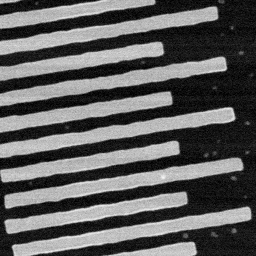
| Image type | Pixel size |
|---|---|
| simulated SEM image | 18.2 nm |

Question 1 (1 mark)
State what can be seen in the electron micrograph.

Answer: groups of lines, slits or small figures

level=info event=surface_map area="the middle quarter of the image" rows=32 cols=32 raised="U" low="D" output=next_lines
UUUUUUUUDDDDDDDDDDDDDDDDDDUUUUUU
DDDDDDDDDDDDDDDDDDDDUUUUUUUUUUUU
DDDDDDDDDDDDDDDUUUUUUUUUUUUUUUUU
DDDDDDDDDUUUUUUUUUUUUUUUUUUDDDDD
UUUUUUUUUUUUUUUUUUUUUDDDDDDDDDDD
UUUUUUUUUUUUUUDDDDDDDDDDDDDDDDDD
UUUUUUUUDDDDDDDDDDDDDDDDDDDDDDDD
UDDDDDDDDDDDDDDDDDDDDDDUUUUDDDDD
DDDDDDDDDDDDDDDDDUUUUUUUUUUDDDDD
DDDDDDDDDDDUUUUUUUUUUUUUUUUDDDDD
DDDDDUUUUUUUUUUUUUUUUUUUUDDDDDDD
UUUUUUUUUUUUUUUUUUDDDDDDDDDDDDDD
UUUUUUUUUUUUDDDDDDDDDDDDDDDDDDDD
UUUUUUDDDDDDDDDDDDDDDDDDDDDUUUUU
DDDDDDDDDDDDDDDDDDDUUUUUUUUUUUUU
DDDDDDDDDDDDUUUUUUUUUUUUUUUUUUUU
DDDDDDDUUUUUUUUUUUUUUUUUUUDDDDDD
DDDDUUUUUUUUUUUUUUUDDDDDDDDDDDDD
UUUUUUUUUUUUUDDDDDDDDDDDDDDDDDDD
UUUUUUUUDDDDDDDDDDDDDDDDDDUUDDDD
UDDDDDDDDDDDDDDDDDDDDDUUUUUUUDDD
DDDDDDDDDDDDDDDUUUUUUUUUUUUUUDDD
DDDDDDDDDUUUUUUUUUUUUUUUUUUUDDDD
DDDDDUUUUUUUUUUUUUUUUUUUDDDDDDDD
UUUUUUUUUUUUUUUUDDDDDDDDDDDDDDDD
UUUUUUUUUUUDDDDDDDDDDDDDDDDDDDUU
UUUUUDDDDDDDDDDDDDDDDDDDDUUUUUUU
DDDDDDDDDDDDDDDDDDDUUUUUUUUUUUUU
DDDDDDDDDDDDDUUUUUUUUUUUUUUUUUUU
DDDDDDDUUUUUUUUUUUUUUUUUUUDDDDDD
DUUUUUUUUUUUUUUUUUUDDDDDDDDDDDDD
UUUUUUUUUUUDDDDDDDDDDDDDDDDDDDDD